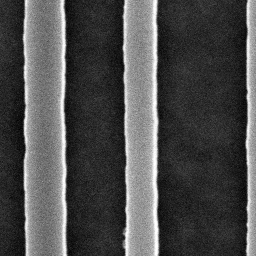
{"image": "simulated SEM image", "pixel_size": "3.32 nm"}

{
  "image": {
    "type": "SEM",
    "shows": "lines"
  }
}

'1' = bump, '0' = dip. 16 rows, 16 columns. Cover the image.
0011000011000001
0011000011000001
0111000011000001
0011000011000001
0011000011000001
0011000011000001
0011000011000001
0011000011000000
0011000011000001
0011000011000001
0011000011000001
0011000011000000
0011000011000000
0011000011000001
0011000011000001
0011000011000001